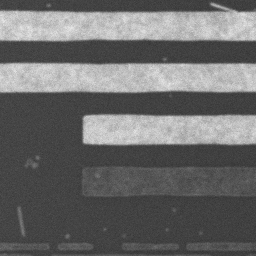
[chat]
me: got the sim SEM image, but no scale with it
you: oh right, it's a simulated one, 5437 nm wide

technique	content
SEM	wiring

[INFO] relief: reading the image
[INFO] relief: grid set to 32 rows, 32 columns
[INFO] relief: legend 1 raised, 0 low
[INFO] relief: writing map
00000000000000000000000000000000
11100000000000000000000000000000
11111111111111111111111111111111
11111111111111111111111111111111
11111111111111111111111111111111
00000000000000000000000000000000
00000000000000000000000000000000
00000000000000000000000000000000
11111111111111111111111111111111
11111111111111111111111111111111
11111111111111111111111111111111
00000000000000000000000000000000
00000000000000000000000000000000
00000000000000000000000000000000
00000000000111111110000000001110
00000000001111111111111111111111
00000000001111111111111111111111
00000000001111111111111111111111
00000000000000000000000000000000
00000000000000000000000000000000
00000000000000000000000000000000
00000000001111111111111111111111
00000000001111111111111111111111
00000000001111111111111111111111
00000000000000000000000000000000
00000000000000000000000000000000
00000000000000000000000000000000
00000000000000000000000000000000
00000000000000000000000000000000
00000000000000000000000000000000
00000000000000000000000000111101
00000000000000000000000000000000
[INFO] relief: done